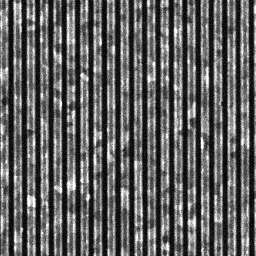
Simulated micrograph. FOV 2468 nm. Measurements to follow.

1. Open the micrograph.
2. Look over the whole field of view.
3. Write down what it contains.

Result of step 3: parallel lines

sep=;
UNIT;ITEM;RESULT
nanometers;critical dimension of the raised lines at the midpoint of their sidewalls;67.5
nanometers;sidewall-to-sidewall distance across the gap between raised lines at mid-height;59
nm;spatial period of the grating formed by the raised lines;129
